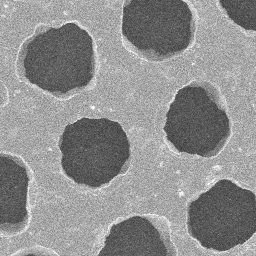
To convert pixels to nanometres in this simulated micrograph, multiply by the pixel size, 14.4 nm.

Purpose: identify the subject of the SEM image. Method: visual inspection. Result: holes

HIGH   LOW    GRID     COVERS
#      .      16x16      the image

########....##..
########....###.
##....##....####
#.....###..#####
#.....##########
###..######..###
###########...##
#####..###....##
####....##....##
####....###...##
..##....########
..###..######..#
..##########....
..##########....
#######...##....
######.....##.##